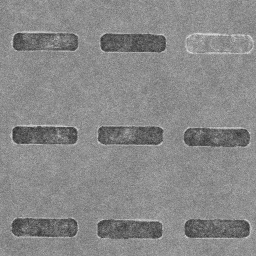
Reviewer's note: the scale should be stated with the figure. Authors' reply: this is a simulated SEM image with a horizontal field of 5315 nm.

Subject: a regular array of holes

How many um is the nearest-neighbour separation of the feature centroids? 1.79